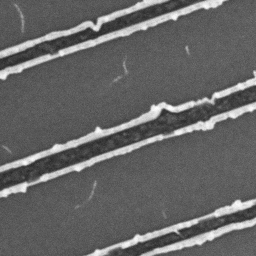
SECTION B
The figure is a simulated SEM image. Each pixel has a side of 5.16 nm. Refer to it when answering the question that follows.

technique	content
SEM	one or a few lines or trenches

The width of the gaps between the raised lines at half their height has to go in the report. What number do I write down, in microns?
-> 0.437